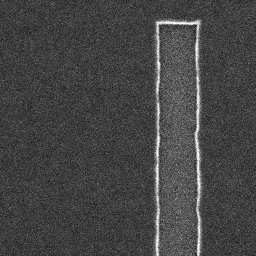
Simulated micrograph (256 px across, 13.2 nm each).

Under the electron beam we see one or a few lines or trenches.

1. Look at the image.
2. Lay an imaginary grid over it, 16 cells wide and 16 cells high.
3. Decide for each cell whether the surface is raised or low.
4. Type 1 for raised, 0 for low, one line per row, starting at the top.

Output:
1111111111111111
1111111111001111
1111111111001111
1111111111001111
1111111111001111
1111111111001111
1111111111001111
1111111111001111
1111111111001111
1111111111001111
1111111111001111
1111111111001111
1111111111001111
1111111111001111
1111111111001111
1111111111001111